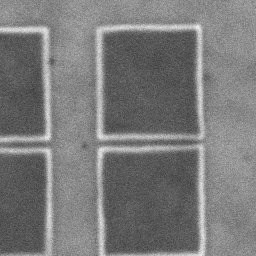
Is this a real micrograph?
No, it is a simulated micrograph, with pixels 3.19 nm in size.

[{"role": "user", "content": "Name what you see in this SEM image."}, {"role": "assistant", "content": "wiring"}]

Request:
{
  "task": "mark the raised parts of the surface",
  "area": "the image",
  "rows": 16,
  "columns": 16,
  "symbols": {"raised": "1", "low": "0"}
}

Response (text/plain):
0000000000000000
0000000000000000
1110001111110000
1110001111110000
1110001111110000
1110001111110000
1110001111110000
1110001111111000
1110000111110000
1110001111111000
1110001111111000
1110001111111000
1110001111111000
1110001111111000
1110001111111000
1110001111111000